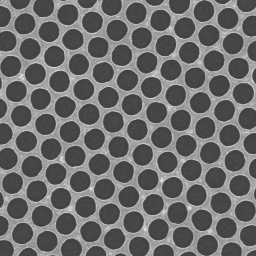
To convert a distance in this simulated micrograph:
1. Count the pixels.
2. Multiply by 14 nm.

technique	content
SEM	a regular array of holes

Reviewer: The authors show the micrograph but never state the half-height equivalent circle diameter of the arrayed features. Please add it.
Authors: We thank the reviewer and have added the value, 295 nm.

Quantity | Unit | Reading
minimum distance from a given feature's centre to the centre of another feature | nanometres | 354